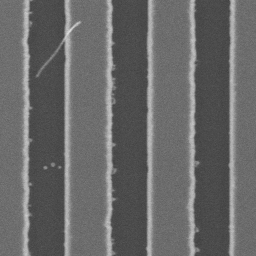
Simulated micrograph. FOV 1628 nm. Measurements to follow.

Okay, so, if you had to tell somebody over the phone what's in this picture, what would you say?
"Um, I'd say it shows lines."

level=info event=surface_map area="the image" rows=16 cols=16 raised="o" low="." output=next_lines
oo..ooo..ooo..oo
oo..ooo..ooo..oo
oo..ooo..ooo..oo
oo..ooo..ooo..oo
oo..ooo..ooo..oo
oo..ooo..ooo..oo
oo..ooo..ooo..oo
oo..ooo..ooo..oo
oo..ooo..ooo..oo
oo..ooo..ooo..oo
oo..ooo..ooo..oo
oo..ooo..ooo..oo
oo..ooo..ooo..oo
oo..ooo..ooo..oo
oo..ooo..ooo..oo
oo..ooo..ooo..oo